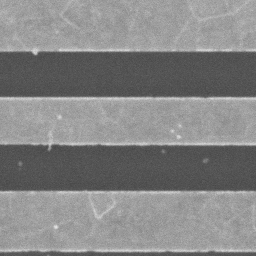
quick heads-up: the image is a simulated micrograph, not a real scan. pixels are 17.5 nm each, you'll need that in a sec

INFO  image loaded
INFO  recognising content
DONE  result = lines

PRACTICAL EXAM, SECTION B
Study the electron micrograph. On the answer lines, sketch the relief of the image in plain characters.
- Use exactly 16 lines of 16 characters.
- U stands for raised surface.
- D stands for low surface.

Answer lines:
UUUUUUUUUUUUUUUU
UUUUUUUUUUUUUUUU
UUUUUUUUUUUUUUUU
DDDDDDDDDDDDDDDD
DDDDDDDDDDDDDDDD
DDDDDDDDDDDDDDDD
UUUUUUUUUUUUUUUU
UUUUUUUUUUUUUUUU
UUUUUUUUUUUUUUUU
DDDDDDDDDDDDDDDD
DDDDDDDDDDDDDDDD
DDDDDDDDDDDDDDDD
UUUUUUUUUUUUUUUU
UUUUUUUUUUUUUUUU
UUUUUUUUUUUUUUUU
UUUUUUUUUUUUUUUU